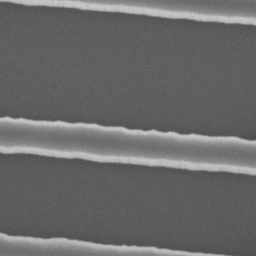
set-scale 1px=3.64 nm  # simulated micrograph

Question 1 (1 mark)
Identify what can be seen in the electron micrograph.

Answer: lines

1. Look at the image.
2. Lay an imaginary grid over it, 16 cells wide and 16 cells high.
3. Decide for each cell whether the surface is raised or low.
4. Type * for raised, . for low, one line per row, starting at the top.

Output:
......**********
................
................
................
................
................
................
**..............
*************...
..**************
..............**
................
................
................
................
**********......